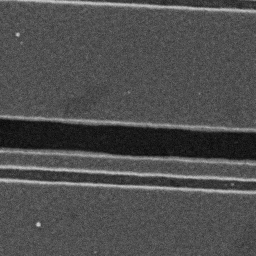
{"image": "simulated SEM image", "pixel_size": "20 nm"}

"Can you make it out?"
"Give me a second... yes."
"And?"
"lines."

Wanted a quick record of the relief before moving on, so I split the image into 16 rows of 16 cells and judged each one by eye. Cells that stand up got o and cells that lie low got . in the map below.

oooooooooooooooo
oooooooooooooooo
oooooooooooooooo
oooooooooooooooo
oooooooooooooooo
oooooooooooooooo
oooooooooooooooo
....oooooooooooo
................
oo..............
oooooooooooooooo
oooooooooooooooo
oooooooooooooooo
oooooooooooooooo
oooooooooooooooo
oooooooooooooooo